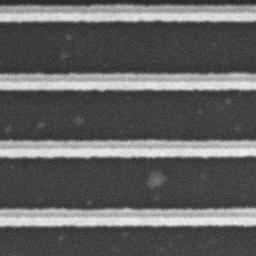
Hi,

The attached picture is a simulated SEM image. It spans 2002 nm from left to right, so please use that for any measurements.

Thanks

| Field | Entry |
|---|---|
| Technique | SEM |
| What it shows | lines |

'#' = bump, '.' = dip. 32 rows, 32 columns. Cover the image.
................................
################################
################################
................................
................................
................................
................................
................................
................................
..#####.#################.######
################################
................................
................................
................................
................................
................................
................................
................................
################################
###############################.
................................
................................
................................
................................
................................
................................
################################
################################
................................
................................
................................
................................